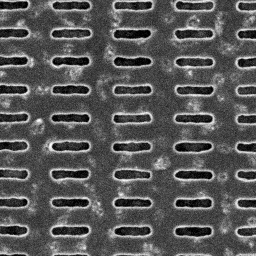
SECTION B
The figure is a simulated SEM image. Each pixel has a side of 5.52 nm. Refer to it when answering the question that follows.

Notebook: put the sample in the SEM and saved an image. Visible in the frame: a regular array of holes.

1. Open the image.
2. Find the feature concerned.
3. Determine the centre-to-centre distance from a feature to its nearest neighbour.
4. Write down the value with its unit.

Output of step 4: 155 nanometres